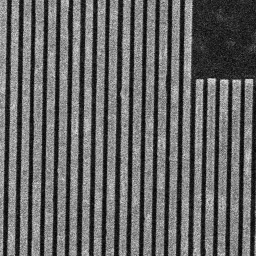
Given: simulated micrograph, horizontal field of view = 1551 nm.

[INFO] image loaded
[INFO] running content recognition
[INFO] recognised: parallel lines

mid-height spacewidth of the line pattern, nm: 27.3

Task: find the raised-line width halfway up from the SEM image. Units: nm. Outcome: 48.5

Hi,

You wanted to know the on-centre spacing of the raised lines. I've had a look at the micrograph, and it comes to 74.9 nm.